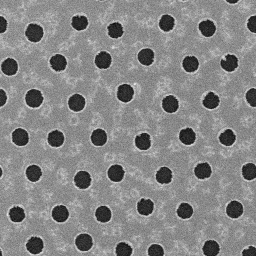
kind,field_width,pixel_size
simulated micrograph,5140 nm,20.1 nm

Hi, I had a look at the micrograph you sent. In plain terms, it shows a regular array of holes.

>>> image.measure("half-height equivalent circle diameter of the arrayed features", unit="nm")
352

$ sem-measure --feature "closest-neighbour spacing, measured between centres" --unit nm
764